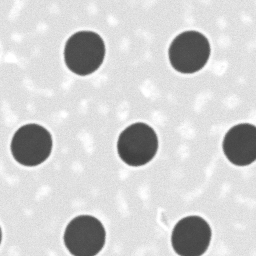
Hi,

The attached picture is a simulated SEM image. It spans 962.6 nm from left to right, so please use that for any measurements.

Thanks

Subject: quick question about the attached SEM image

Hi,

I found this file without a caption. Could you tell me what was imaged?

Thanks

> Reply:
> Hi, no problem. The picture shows holes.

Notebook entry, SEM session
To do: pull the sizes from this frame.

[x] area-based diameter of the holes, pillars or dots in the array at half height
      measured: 163 nanometers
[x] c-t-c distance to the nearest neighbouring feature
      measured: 396 nm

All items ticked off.